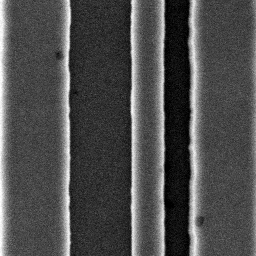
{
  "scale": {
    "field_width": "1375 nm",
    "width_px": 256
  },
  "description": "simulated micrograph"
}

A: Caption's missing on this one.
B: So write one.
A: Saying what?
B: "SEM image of lines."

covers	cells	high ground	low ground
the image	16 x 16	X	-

XXXX----XX--XXXX
XXXX----XX--XXXX
XXXX----XX--XXXX
XXXX----XX--XXXX
XXXX----XX--XXXX
XXXX----XX--XXXX
XXXX----XX--XXXX
XXXX----XX--XXXX
XXXX----XX--XXXX
XXXX----XX--XXXX
XXXX----XX--XXXX
XXXX----XX--XXXX
XXXX----XX--XXXX
XXXX----XX--XXXX
XXXX----XX--XXXX
XXXX----XX--XXXX